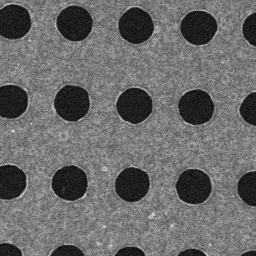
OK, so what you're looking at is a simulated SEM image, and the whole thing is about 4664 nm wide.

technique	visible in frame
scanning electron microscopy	a regular array of holes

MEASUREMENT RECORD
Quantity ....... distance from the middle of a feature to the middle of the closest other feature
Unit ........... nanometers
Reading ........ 1130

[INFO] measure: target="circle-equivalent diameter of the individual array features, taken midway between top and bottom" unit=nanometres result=657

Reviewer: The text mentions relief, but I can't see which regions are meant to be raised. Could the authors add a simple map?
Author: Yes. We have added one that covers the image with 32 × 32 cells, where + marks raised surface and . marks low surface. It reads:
++++++++++++++++++++++++++++++++
....++++...+++++..++++++..++++++
....+++.....+++....++++....++++.
....+++.....+++....++++....+++..
...+++++...++++....++++....+++..
++++++++++++++++++++++++..+++++.
++++++++++++++++++++++++++++++++
++++++++++++++++++++++++++++++++
++++++++++++++++++++++++++++++++
++++++++++++++++++++++++++++++++
++++++++++++++++++++++++++++++++
...++++....++++...+++++...++++++
....+++....++++....++++...++++..
...++++....++++....+++.....+++..
..+++++....++++....++++....+++..
++++++++++++++++++++++++.++++++.
++++++++++++++++++++++++++++++++
++++++++++++++++++++++++++++++++
++++++++++++++++++++++++++++++++
++++++++++++++++++++++++++++++++
++++++++++++++++++++++++++++++++
...++++...+++++...+++++...+++++.
...+++.....+++.....+++....++++..
...++++....+++.....+++.....+++..
..+++++...+++++...++++....++++..
++++++++++++++++++++++++.++++++.
++++++++++++++++++++++++++++++++
++++++++++++++++++++++++++++++++
++++++++++++++++++++++++++++++++
++++++++++++++++++++++++++++++++
..++++++++++++++++++++++++++++++
...++++...+++++...+++++..++++++.